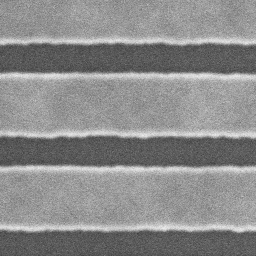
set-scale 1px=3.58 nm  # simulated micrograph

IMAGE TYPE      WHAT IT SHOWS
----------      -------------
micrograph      lines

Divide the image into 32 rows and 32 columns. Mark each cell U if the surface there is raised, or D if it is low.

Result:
UUUUUUUUUUUUUUUUUUUUUUUUUUUUUUUU
UUUUUUUUUUUUUUUUUUUUUUUUUUUUUUUU
UUUUUUUUUUUUUUUUUUUUUUUUUUUUUUUU
UUUUUUUUUUUUUUUUUUUUUUUUUUUUUUUU
UUUUUUUUUUUUUUUUUUUUUUUUUUUUUUUU
DDDDDDDDDDDDDDDDDDDDDDUDDDDDDDDD
DDDDDDDDDDDDDDDDDDDDDDDDDDDDDDDD
DDDDDDDDDDDDDDDDDDDDDDDDDDDDDDDD
DDDDDDDDDDDDDDDDDDDDDDDDDDDDDDDD
UUUUUUUUUUUUUUUUUUUUUUUUUUUUUUUU
UUUUUUUUUUUUUUUUUUUUUUUUUUUUUUUU
UUUUUUUUUUUUUUUUUUUUUUUUUUUUUUUU
UUUUUUUUUUUUUUUUUUUUUUUUUUUUUUUU
UUUUUUUUUUUUUUUUUUUUUUUUUUUUUUUU
UUUUUUUUUUUUUUUUUUUUUUUUUUUUUUUU
UUUUUUUUUUUUUUUUUUUUUUUUUUUUUUUU
UUUUUUUUUUUUUUUUUUUUUUUUUUUUUUUU
DDDDDDDDDDDDDDDDDDDDDDDDDDDDDDDD
DDDDDDDDDDDDDDDDDDDDDDDDDDDDDDDD
DDDDDDDDDDDDDDDDDDDDDDDDDDDDDDDD
DDDDDDDDDDDDDDDDDDDDDDDDDDDDDDDD
UUUUUUUUUUUUUUUUUUUUUUUUUUUUUUUU
UUUUUUUUUUUUUUUUUUUUUUUUUUUUUUUU
UUUUUUUUUUUUUUUUUUUUUUUUUUUUUUUU
UUUUUUUUUUUUUUUUUUUUUUUUUUUUUUUU
UUUUUUUUUUUUUUUUUUUUUUUUUUUUUUUU
UUUUUUUUUUUUUUUUUUUUUUUUUUUUUUUU
UUUUUUUUUUUUUUUUUUUUUUUUUUUUUUUU
UUUUUUUUUUUUUUUUUUUUUUUUUUUUUUUU
DDDDDDDDDDDDDDDDDDDDDDDDDDDDDDDD
DDDDDDDDDDDDDDDDDDDDDDDDDDDDDDDD
DDDDDDDDDDDDDDDDDDDDDDDDDDDDDDDD